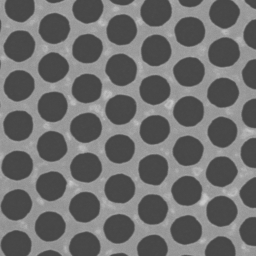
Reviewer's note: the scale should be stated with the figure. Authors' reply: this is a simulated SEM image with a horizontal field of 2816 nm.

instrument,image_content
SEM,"a regular array of holes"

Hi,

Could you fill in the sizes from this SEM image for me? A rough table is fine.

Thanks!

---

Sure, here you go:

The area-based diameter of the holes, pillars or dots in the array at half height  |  339 nanometres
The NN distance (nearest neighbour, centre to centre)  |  428 nm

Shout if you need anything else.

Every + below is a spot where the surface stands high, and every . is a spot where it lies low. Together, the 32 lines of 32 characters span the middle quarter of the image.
.+++++++++........++++..++++....
.+++++++++........+++++++++.....
.++++..++++.......+++++++++.....
+++......++.......++.....+++....
++.......+++.....++.......++....
++........+++..++++........+++..
++.......++++++++++........+++++
++.......+++++.++++........+++++
+++......+++.....++.......+++...
.+++....+++.......++.....+++....
.+++++++++........++++++++++....
.+++++++++........+++++++++.....
++++....++........+++++++++.....
+++......++......+++.....+++....
++.......+++....+++.......++....
++........+++++++++........+++..
+........++++++++++........+++++
++.......++++++++++.......++++++
+++.....+++......++.......+++...
.+++...++++......+++.....+++....
.+++++++++........++++++++++....
.+++++++++........+++++++++.....
++++....++.......++++++++++.....
++.......++......+++.....+++....
++.......+++....+++.......++....
++.......++++++++++.......++++.+
++........+++++++++.......++++++
++.......++++..++++.......++++++
++......+++......++......++++...
.+++...++++......+++.....+++....
.+++++++++........+++++++++.....
++++++++++........+++++++++.....